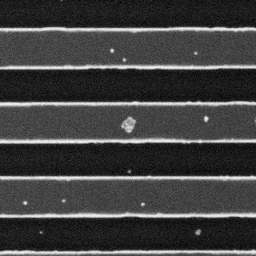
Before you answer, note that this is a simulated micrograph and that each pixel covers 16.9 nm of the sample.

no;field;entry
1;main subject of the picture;lines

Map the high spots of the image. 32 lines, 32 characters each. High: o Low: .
................................
................................
................................
................................
oooooooooooooooooooooooooooooooo
oooooooooooooooooooooooooooooooo
oooooooooooooooooooooooooooooooo
oooooooooooooooooooooooooooooooo
ooooooooooo...........ooooo.....
................................
................................
................................
................................
oooooooooooooooooooooooooooooooo
oooooooooooooooooooooooooooooooo
oooooooooooooooooooooooooooooooo
oooooooooooooooooooooooooooooooo
oooooooooooooooooooooooooooooooo
................................
................................
................................
................................
oooooooooooooooooooooooooooooooo
oooooooooooooooooooooooooooooooo
oooooooooooooooooooooooooooooooo
oooooooooooooooooooooooooooooooo
oooooooooooooooooooooooooooooooo
................................
................................
................................
................................
...o.......o...ooooooooooooooooo